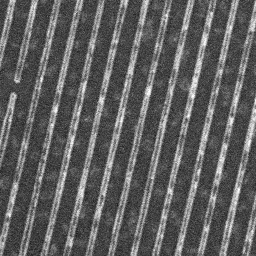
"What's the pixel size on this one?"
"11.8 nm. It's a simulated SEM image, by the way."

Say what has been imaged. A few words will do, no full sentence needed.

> parallel lines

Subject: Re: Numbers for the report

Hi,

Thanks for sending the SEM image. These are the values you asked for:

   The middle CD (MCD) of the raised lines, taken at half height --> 57.6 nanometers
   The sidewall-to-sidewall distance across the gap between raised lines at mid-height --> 199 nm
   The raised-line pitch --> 256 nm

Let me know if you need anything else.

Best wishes